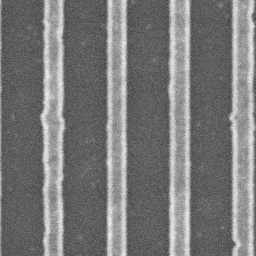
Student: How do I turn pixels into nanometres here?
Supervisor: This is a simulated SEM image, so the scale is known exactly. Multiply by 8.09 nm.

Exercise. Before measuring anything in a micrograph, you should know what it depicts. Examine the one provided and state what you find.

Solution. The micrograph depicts one or a few lines or trenches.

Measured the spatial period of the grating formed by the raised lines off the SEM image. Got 511 nm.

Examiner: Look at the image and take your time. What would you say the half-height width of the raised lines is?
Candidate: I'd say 0.122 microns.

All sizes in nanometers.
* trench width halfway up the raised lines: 389